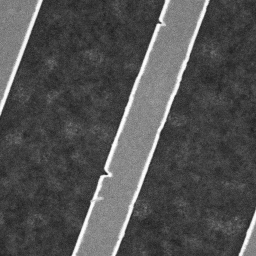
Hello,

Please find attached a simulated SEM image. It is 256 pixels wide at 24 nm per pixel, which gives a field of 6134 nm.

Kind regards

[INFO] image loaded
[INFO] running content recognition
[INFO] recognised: one or a few lines or trenches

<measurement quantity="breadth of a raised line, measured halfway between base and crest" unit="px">37.5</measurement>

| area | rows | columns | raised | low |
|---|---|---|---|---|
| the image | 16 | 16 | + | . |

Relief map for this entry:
++........+++...
++........++....
++........++....
+........+++....
+........++.....
+.......+++.....
........+++.....
........++......
.......+++......
.......++.......
.......++.......
......+++.......
......++........
......++........
.....+++........
.....++........+